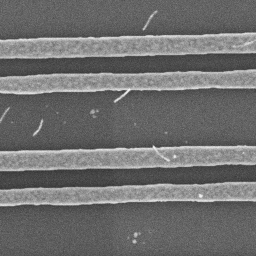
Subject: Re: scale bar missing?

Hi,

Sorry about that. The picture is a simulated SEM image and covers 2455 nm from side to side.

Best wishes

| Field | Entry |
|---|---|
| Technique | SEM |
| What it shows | lines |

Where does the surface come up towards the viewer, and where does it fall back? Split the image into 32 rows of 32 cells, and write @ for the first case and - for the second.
--------------------------------
--------------------------------
--------------------------------
--------------------------------
------------------@@@@@@@@@@@@@@
@@@@@@@@@@@@@@@@@@@@@@@@@@@@@@@@
@@@@@@@@@@@@@@@@@@@@@@@@@@@@@@@@
--------------------------------
--------------------------------
---@@@@@@@@@@@@@@@@@@@@@@@@@@@@@
@@@@@@@@@@@@@@@@@@@@@@@@@@@@@@@@
@@@@@@@-------------------------
--------------------------------
--------------------------------
--------------------------------
--------------------------------
--------------------------------
--------------------------------
-------------------@@@@@@@@@@@@@
@@@@@@@@@@@@@@@@@@@@@@@@@@@@@@@@
@@@@@@@@@@@@@@@@@@@@@@@@@@@@--@@
--------------------------------
--------------------------------
-----@--@@@@@@@@@@@@@@@@@@@@@@@@
@@@@@@@@@@@@@@@@@@@@@@@@@@@@@@@@
@@@---@@@@----------------------
--------------------------------
--------------------------------
--------------------------------
--------------------------------
--------------------------------
--------------------------------